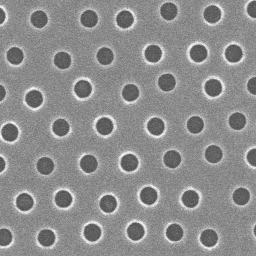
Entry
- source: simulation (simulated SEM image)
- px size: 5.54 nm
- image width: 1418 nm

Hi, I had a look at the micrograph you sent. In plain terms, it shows a regular array of holes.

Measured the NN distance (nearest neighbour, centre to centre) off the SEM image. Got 0.21 micrometres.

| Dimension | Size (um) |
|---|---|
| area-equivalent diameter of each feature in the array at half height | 0.101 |